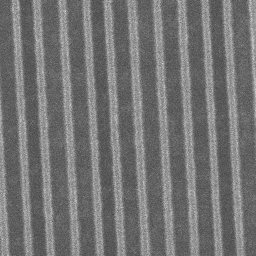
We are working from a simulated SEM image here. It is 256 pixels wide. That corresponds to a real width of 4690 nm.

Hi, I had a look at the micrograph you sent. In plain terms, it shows parallel lines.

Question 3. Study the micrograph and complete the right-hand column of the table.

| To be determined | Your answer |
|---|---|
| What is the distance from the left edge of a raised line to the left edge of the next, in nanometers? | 429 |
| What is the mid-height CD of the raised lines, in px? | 7.74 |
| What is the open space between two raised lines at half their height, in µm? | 0.297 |